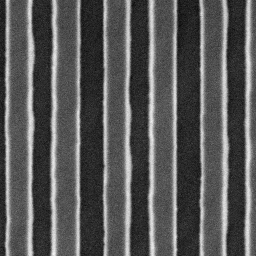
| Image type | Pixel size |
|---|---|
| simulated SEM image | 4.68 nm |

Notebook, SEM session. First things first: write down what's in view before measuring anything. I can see lines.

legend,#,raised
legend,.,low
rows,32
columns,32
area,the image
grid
.###...###...###...###...###...#
.###...###...###...###...###...#
.###...###...###...###...###...#
.###...###...###...###...###...#
.###...###...###...###...###...#
.###...###...###...###...###...#
.###...###...###...###...###...#
.###...###...###...###...###...#
.###...###...###...###...###...#
.###...###...###...###...###...#
.###...###...###...###...###...#
.###...###...###...###...###...#
.###...###...###...###...###...#
.###...###...###...###...###...#
.###...###...###...###...###...#
.###...###...###...###...###...#
.###...###...###...###...###...#
.###...###...###...###...###...#
.###...###...###...###...###...#
.###...###...###...###...###...#
.###...###...###...###...###...#
.###...###...###...###...###...#
.###...###...###...###...###...#
.###...###...###...###...###...#
.###...###...###...###...###...#
.###...###...###...###...###...#
.###...###...###...###...###...#
.###...###...###...###...###...#
.###...###...###...###...###...#
.###...###...###...###...###...#
.###...###...###...###...###...#
.###...###...###...###...###...#